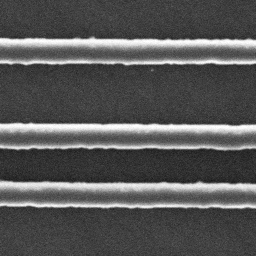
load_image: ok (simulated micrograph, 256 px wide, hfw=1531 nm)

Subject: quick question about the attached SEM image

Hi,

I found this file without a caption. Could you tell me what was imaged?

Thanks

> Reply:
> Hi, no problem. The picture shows lines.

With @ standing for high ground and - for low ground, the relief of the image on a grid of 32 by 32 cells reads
--------------------------------
--------------------------------
--------------------------------
--------------------------------
--------------------------------
@@@@@@@@@@@@@@@@@@@@@@@@@@@@@@@@
@@@@@@@@@@@@@@@@@@@@@@@@@@@@@@@@
@@@@@@@@@@@@@@@@@@@@@@@@@@@@@@@@
--------------------------------
--------------------------------
--------------------------------
--------------------------------
--------------------------------
--------------------------------
--------------------------------
--------------------------------
@@@@@@@@@@@@@@@@@@@@@@@@@@@@@@@@
@@@@@@@@@@@@@@@@@@@@@@@@@@@@@@@@
-@@@@@@@@--@-@@@@@--@@@@@-@@@@@@
--------------------------------
--------------------------------
--------------------------------
--------------------------------
@@@@@@@@@@@@@@@@@@@@@@@@@@@@@@@@
@@@@@@@@@@@@@@@@@@@@@@@@@@@@@@@@
@@@@@@@@@@@@@@@@@@@@@@@@@@@@@@@@
--------------------------------
--------------------------------
--------------------------------
--------------------------------
--------------------------------
--------------------------------